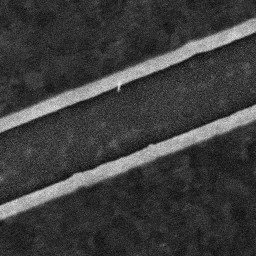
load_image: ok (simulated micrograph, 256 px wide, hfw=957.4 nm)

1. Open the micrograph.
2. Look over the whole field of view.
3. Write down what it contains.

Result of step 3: one or a few lines or trenches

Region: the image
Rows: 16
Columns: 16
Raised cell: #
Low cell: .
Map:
################
################
##############..
###########.....
#########.......
######..........
###.............
#..............#
............####
..........######
.......#########
....############
..##############
################
################
################